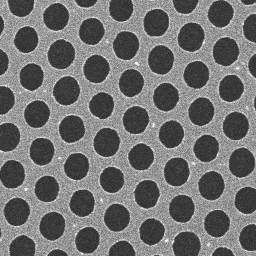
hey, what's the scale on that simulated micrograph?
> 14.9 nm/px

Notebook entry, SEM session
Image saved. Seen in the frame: a regular array of holes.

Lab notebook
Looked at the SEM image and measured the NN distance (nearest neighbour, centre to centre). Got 553 nm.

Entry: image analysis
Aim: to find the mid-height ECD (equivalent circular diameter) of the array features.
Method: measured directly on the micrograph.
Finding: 406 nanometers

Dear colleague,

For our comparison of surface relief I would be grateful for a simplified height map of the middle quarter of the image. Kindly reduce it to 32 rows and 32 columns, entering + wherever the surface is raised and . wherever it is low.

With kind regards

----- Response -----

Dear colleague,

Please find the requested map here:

.++++......++++++++++......++++.
+++++.......+++...++++.....+++..
+++++......+++.....++++...++++..
...++.....++++......++++++++++..
...++++...++++......++++++++++..
....++++++++++......+++.....+++.
....++++++++++.....++++.....++++
....++++...++++....+++.......+++
....+++.....++++++++++.......+++
...+++......++++++++++.......+++
++++++.......++++.+++++.....+++.
++++++......++++.....+++...++++.
+++++++.....+++......++++++++++.
....+++++..++++......++++++++++.
.....++++++++++......++++...++++
.....++++++++++......+++.....+++
.....++++....++.....++++......++
.....+++......+++.++++++......++
.....++.......++++++++++......++
...++++.......++++++++++.....+++
+++++++.......++++...++++...++++
++++++++......++......++++++++++
++...+++.....+++......++++++++++
+.....++++++++++.......++++...++
......++++++++++......++++.....+
......+++++++++++.....+++......+
......++++....++++..+++++......+
......+++......++++++++++......+
+....++++......++++++++++......+
+++++++++......++++....+++.....+
+++++++++......+++.....++++..+++
++++..++++....++++......++++++++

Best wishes